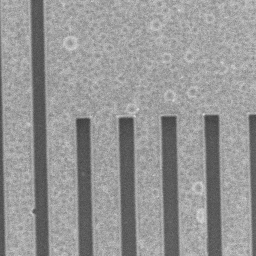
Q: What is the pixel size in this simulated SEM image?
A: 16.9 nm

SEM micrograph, parallel lines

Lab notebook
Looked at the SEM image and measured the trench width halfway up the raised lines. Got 0.255 µm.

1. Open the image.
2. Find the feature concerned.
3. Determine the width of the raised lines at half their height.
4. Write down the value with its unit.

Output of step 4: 0.479 um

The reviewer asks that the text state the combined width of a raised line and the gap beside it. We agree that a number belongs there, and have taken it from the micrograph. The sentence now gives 730 nm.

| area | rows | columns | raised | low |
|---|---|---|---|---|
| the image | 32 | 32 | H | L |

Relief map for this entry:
HHHHLLHHHHHHHHHHHHHHHHHHHHHHHHHH
HHHHLLHHHHHHHHHHHHHHHHHHHHHHHHHH
HHHHLLHHHHHHHHHHHHHHHHHHHHHHHHHH
HHHHLLHHHHHHHHHHHHHHHHHHHHHHHHHH
HHHHLLHHHHHHHHHHHHHHHHHHHHHHHHHH
HHHHLLHHHHHHHHHHHHHHHHHHHHHHHHHH
HHHHLLHHHHHHHHHHHHHHHHHHHHHHHHHH
HHHHLLHHHHHHHHHHHHHHHHHHHHHHHHHH
HHHHLLHHHHHHHHHHHHHHHHHHHHHHHHHH
HHHHLLHHHHHHHHHHHHHHHHHHHHHHHHHH
HHHHLLHHHHHHHHHHHHHHHHHHHHHHHHHH
HHHHLLHHHHHHHHHHHHHHHHHHHHHHHHHH
HHHHLLHHHHHHHHHHHHHHHHHHHHHHHHHH
HHHHLLHHHHHHHHHHHHHHHHHHHHHHHHHH
HHHHLLHHHHHHHHHHHHHHHLHHHHLHHHHL
HHHHLLHHHLLHHHHLLHHHLLHHHLLHHHHL
HHHHLLHHHLLHHHHLLHHHLLHHHHLLHHHL
HHHHLLHHHLLHHHHLLHHHLLHHHHLLHHHL
LHHHLLHHHLLHHHHLLHHHLLHHHHLLHHHL
LHHHLLHHHHLLHHHLLHHHLLHHHHLLHHHL
LHHHLLHHHHLLHHHLLHHHLLHHHHLLHHHL
LHHHLLHHHHLLHHHLLHHHLLHHHHLLHHHL
LHHHLLHHHHLLHHHLLHHHLLHHHHLLHHHL
LHHHLLHHHHLLHHHLLHHHLLHHHHLLHHHL
LHHHLLHHHHLLHHHLLHHHLLHHHHLLHHHL
LHHHLLHHHHLLHHHLLHHHLLHHHHLLHHHL
LHHHLLHHHHLLHHHLLHHHLLHHHHLLHHHL
LHHHLLHHHHLLHHHLLHHHLLHHHHLLHHHL
LHHHLLHHHHLLHHHLLHHHLLHHHHLLHHHL
LHHHLLHHHHLLHHHLLHHHLLHHHHLLHHHL
LHHHLLHHHHLLHHHLLHHHLLLHHHLLHHHL
LHHHLLHHHHLLHHHLLHHHLLLHHHLLHHHL